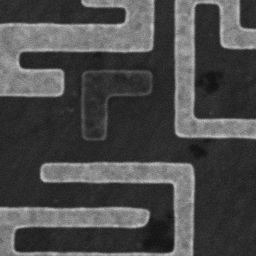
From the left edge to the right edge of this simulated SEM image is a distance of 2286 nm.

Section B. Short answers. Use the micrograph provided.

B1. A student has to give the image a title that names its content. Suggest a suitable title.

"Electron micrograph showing wiring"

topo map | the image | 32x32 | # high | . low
...........########...###..###..
................###...##....##..
................###...##....##..
###################...##....###.
###################...##....####
###################...##....####
###...................##........
##....................##........
###...................##........
########..#########...##........
########..#########...##........
########..#########...##........
..........###.........##........
..........###.........##........
..........###.........##........
..........###.........##########
..........###.........##########
...........##...................
................................
................................
...........#######.##...........
.....###################........
.....###################........
......................##........
......................##........
......................##........
##################....##........
##################....##........
###...................##........
##....................##........
##....................##........
##...................###........